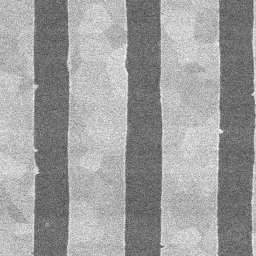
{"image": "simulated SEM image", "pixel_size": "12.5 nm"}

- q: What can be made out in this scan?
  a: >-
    one or a few lines or trenches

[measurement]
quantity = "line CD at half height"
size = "710 nm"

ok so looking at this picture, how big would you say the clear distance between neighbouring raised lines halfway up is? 442 nanometres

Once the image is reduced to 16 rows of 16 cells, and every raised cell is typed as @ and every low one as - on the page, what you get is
@@--@@@@--@@@@--
@@--@@@@--@@@@--
@@--@@@@--@@@@--
@@--@@@@--@@@@--
@@--@@@@--@@@@--
@@--@@@@--@@@@--
@@--@@@@--@@@@--
@@--@@@@--@@@@--
@@--@@@@--@@@@--
@@--@@@@--@@@@--
@@--@@@@--@@@@--
@@--@@@@--@@@@--
@@--@@@@--@@@@--
@@--@@@@--@@@@--
@@--@@@@--@@@@--
@@--@@@@--@@@@--